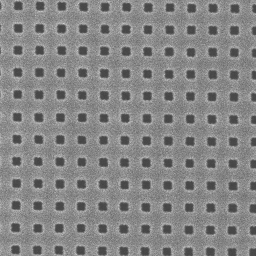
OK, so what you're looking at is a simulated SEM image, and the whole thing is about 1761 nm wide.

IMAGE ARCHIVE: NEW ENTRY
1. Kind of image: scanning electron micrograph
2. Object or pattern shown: a regular array of holes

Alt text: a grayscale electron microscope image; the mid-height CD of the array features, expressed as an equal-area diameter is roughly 62.6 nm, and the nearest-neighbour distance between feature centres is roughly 0.148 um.